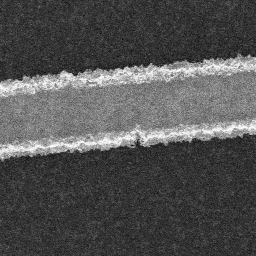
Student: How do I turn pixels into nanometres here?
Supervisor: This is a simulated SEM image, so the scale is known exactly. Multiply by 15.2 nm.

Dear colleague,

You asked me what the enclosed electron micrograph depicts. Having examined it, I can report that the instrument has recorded one or a few lines or trenches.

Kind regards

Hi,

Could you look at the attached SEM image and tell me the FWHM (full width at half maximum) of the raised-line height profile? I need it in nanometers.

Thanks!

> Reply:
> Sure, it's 950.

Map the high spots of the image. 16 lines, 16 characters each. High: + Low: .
................
................
................
................
..........++++++
.+++++++++++++++
++++++++++++++++
++++++++++++++++
++++++++.+......
................
................
................
................
................
................
................